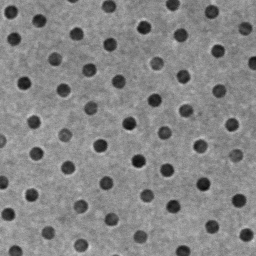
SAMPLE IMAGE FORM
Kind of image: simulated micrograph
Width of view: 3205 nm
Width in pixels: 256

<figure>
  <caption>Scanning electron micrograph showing a regular array of holes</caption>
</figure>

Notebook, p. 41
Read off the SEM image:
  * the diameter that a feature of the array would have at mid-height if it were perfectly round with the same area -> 183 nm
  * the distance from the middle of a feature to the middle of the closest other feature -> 410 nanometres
